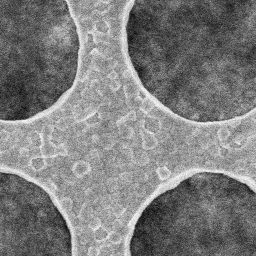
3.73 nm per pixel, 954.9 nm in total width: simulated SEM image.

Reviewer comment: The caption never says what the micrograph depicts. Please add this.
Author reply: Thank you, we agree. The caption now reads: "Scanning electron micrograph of holes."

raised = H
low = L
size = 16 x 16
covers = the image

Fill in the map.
LLLLHHHHLLLLLLLL
LLLLLHHHLLLLLLLL
LLLLLHHHLLLLLLLL
LLLLLHHHLLLLLLLL
LLLLLHHHLLLLLLLL
LLLLHHHHHLLLLLLL
LLLLHHHHHHLLLLLL
LHHHHHHHHHHHLLHH
HHHHHHHHHHHHHHHH
HHHHHHHHHHHHHHHH
HHHHHHHHHHHHHHHH
LLHHHHHHHHHLLLLL
LLLHHHHHHHLLLLLL
LLLLHHHHHLLLLLLL
LLLLHHHHLLLLLLLL
LLLLHHHHLLLLLLLL